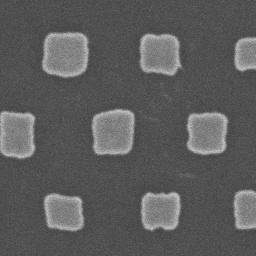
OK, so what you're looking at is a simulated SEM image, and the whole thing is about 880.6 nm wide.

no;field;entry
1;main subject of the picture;raised bodies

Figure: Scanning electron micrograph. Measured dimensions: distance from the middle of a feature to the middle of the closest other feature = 312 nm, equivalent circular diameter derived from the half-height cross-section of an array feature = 144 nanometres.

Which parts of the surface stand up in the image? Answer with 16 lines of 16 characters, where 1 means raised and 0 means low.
0000000000000000
0000000000000000
0001100001100001
0001100001100001
0001100000100000
0000000000000000
0000000000000000
1100001100001100
1100001100001100
1100001100001100
0000000000000000
0000000000000000
0001100001100001
0001100001100001
0000000000000000
0000000000000000